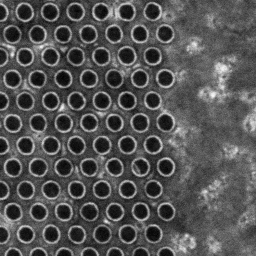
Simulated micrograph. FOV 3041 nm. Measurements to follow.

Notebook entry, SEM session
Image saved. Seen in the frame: a regular array of raised bodies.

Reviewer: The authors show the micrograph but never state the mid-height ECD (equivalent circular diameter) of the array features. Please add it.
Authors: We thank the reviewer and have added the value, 0.209 um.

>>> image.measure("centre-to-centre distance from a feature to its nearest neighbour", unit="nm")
301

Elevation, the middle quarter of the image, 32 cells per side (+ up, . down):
................................
..................++.....+......
++..++++...+++...++++..++++.....
++..++++..+++++..++++..++++.....
++..++++...++++..++++..++++.....
+....++....+++....++....++......
................................
..++....+++...+++....++.........
.++++..++++...++++..++++........
.++++..+++++..++++..++++........
..+++...+++...++++...+++........
................................
..................++.....+......
+....+++...+++...++++..++++.....
++..++++...++++..++++..++++.....
++..++++...++++..++++..++++.....
+....+++...+++....+++...+++.....
................................
..++....+++...+++....+++........
.++++..++++...++++..++++........
.++++..+++++..++++..++++........
.++++...+++...++++..++++........
...+.....+......................
................................
+....+++...+++...++++...+++.....
++..++++...++++..++++..+++++....
++..++++...++++..++++..+++++....
+....+++....++....+++...+++.....
................................
..+.....+++....++....++.........
.++++..+++++..++++..++++........
.++++..+++++..++++..++++........